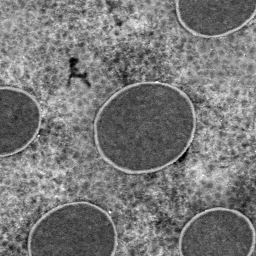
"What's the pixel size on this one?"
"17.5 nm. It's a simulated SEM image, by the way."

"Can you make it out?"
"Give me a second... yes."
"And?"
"raised bodies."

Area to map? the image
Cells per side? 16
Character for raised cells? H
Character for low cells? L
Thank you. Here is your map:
LLLLLLLLLLLHHHHH
LLLLLLLLLLLHHHHL
LLLLLLLLLLLLLLLL
LLLLLLLLLLLLLLLL
LLLLLLLLLLLLLLLL
LLLLLLLLHHHLLLLL
HHLLLLLHHHHHLLLL
HHHLLLHHHHHHLLLL
HHLLLLHHHHHHLLLL
HLLLLLHHHHHLLLLL
LLLLLLLHHHLLLLLL
LLLLLLLLLLLLLLLL
LLLLLLLLLLLLLLLL
LLLHHHHLLLLLHHHL
LLHHHHHLLLLHHHHH
LLHHHHHLLLLHHHHH